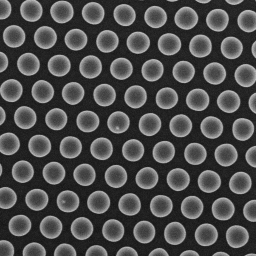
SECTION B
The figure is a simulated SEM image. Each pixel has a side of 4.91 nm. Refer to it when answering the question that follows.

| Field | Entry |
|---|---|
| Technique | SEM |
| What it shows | an array of small figures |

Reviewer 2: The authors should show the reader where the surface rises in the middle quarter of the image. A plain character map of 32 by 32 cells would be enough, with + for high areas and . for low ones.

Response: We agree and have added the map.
++..+++++...+++++...+++++...++++
+...+++++...+++++..++++++..+++++
+...+++++...+++++...+++++..+++++
......+......+++....++++....++++
.............................++.
++++.....+++.....++.............
+++++...+++++...++++....+++.....
+++++..++++++..+++++...+++++...+
+++++...+++++..+++++...+++++...+
.+++....++++...+++++...+++++...+
................+++.....+++....+
................................
....++++....+++......++.........
+..++++++..+++++...+++++...++++.
+..++++++..+++++...+++++...+++++
....++++...+++++...+++++...+++++
....++++....++++...+++++...+++++
....................+++....++++.
+++......+......................
++++...+++++...++++.....++......
++++...+++++...+++++...++++....+
++++...+++++...+++++..++++++..++
++++...+++++...+++++..++++++..++
........+++....++++....++++...++
.......................+++.....+
....+++.....++..................
...+++++...++++....+++.....+++..
..++++++..++++++..+++++...+++++.
...+++++..++++++..+++++...+++++.
...++++....++++...+++++...+++++.
............+++....++++...+++++.
............................++..